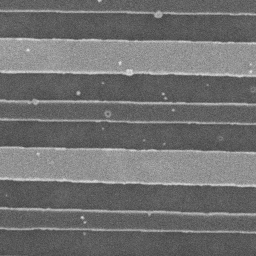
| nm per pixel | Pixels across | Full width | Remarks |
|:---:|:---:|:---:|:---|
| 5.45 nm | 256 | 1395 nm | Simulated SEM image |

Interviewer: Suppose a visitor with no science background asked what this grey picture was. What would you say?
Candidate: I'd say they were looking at lines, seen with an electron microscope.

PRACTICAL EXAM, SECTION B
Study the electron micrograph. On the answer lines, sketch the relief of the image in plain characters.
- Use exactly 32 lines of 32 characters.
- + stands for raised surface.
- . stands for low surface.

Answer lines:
++++++++++++++++++++++++++++++++
.......+++++++++++++++++++++++++
................................
................................
................................
++++++++++++++++++++++++++++++++
++++++++++++++++++++++++++++++++
++++++++++++++++++++++++++++++++
++++++++++++++++++++++++++++++++
................................
................................
................................
................................
++++++++++++++++++++++++++++++++
++++++++++++++++++++++++++++++++
............................++++
................................
................................
+++.............................
++++++++++++++++++++++++++++++++
++++++++++++++++++++++++++++++++
++++++++++++++++++++++++++++++++
..++++++++++++++++++++++++++++++
................................
................................
................................
+++++++++++++++++++.............
++++++++++++++++++++++++++++++++
++++++++++++++++++++++++++++++++
................................
................................
................................